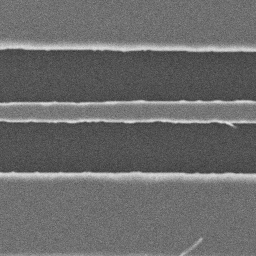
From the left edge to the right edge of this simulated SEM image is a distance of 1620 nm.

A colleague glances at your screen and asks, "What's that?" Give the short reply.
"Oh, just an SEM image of lines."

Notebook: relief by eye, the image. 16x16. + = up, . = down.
++++++++++++++++
++++++++++++++++
++++++++++++++++
................
................
................
++++++++++++++++
++++++++++++++++
................
................
................
++++++++++++++++
++++++++++++++++
++++++++++++++++
++++++++++++++++
++++++++++++++++